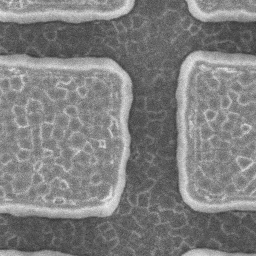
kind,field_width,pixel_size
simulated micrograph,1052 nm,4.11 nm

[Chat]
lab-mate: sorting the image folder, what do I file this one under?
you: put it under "raised bodies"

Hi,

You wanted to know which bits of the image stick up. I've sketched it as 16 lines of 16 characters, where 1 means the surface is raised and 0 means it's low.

1111111100001111
0000000000000000
0000000000000000
0000000000001000
1111111100001111
1111111100011111
1111111100011111
1111111100011111
1111111100011111
1111111100011111
1111111100011111
1111111100011111
1111111000001111
0000000000000000
0000000000000000
0000000000000000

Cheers